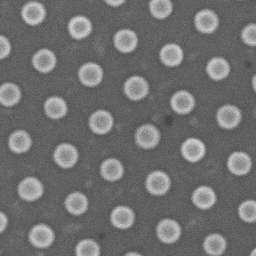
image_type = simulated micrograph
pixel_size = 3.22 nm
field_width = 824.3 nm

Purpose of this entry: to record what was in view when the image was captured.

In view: a regular array of raised bodies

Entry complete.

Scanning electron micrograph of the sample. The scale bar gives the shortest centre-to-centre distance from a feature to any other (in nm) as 154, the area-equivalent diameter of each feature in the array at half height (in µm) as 0.073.